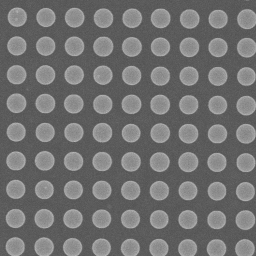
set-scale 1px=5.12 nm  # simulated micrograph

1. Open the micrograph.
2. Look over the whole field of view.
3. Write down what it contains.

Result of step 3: an array of small figures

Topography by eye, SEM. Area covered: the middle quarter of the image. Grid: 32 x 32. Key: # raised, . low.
..#......#......................
.####...####...####...####....##
#####...####...####...####...###
#####...####...####...####...###
.###....###....####...####...###
................................
................................
................................
.###....###....####...####....##
#####..#####...####...####...###
#####..#####...####...####...###
.###....####...####...####...###
........................#.......
................................
................................
.###....###....###.....###....##
#####..#####...####...####...###
#####..#####...####...####...###
.###....####...####...####...###
.......................##.....##
................................
................................
.###....###....###.....##.....##
#####..#####...####...####...###
#####..#####..#####...####...###
####...#####...####...####...###
.##.....###....###....###.....##
................................
................................
.###....###.....##.....##.....##
####...#####...####...####...###
#####..#####..#####...####...###